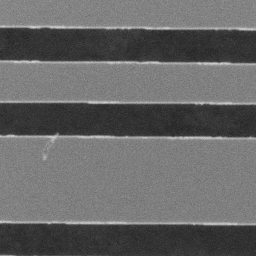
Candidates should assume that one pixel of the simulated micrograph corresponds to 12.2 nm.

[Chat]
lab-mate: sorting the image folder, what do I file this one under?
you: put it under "lines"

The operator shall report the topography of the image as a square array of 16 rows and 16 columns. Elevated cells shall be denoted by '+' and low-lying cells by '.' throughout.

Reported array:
++++++++++++++++
++++++++++++++++
................
................
++++++++++++++++
++++++++++++++++
................
................
+..+............
++++++++++++++++
++++++++++++++++
++++++++++++++++
++++++++++++++++
++++++++++++++++
................
................